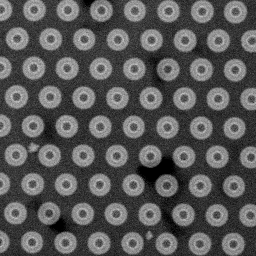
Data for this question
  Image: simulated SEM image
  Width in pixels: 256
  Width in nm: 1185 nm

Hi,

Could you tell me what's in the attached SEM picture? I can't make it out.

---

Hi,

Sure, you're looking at an array of small figures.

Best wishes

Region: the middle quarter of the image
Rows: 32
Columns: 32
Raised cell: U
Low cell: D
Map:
UUUUDDDUUUUUDDDUUUUUDDDUUUUUUDDD
UUUUDDDUUUUUDDDUUUUUDDDUUUUUUDDD
UUUDDDDUUUUUDDDUUUUUDDDDUUUUUDDD
UUDDDDDDUUUDDDDDUUUDDDDDUUUUDDDD
DDDDDDDDDDDDDDDDDDDDDDDDDDDDDDDD
DDDDDDDDDDDDDDDDDDDDDDDDDDDDDDDD
DDDUUUUDDDDDUUUDDDDDUUUUDDDDUUUU
DDUUUUUUDDDUUUUUDDDUUUUUDDDDUUUU
DDUUUUUUDDDUUUUUDDDUUUUUDDDUUUUU
DDUUUUUDDDDUUUUUDDDUUUUUDDDDUUUU
DDDUUUUDDDDUUUUDDDDDUUUUDDDDUUUU
DDDDDDDDDDDDDDDDDDDDDDDDDDDDDDDD
DDDDDDDDDDDDDDDDDDDDDDDDDDDDDDDD
UUUDDDDUUUUDDDDDUUUDDDDDUUUDDDDD
UUUDDDDUUUUUDDDUUUUUDDDUUUUUDDDD
UUUDDDUUUUUUDDDUUUUUDDDUUUUUDDDD
UUUDDDUUUUUUDDDUUUUUDDDUUUUUDDDD
UUUDDDDUUUUDDDDUUUUUDDDDUUUUDDDD
DDDDDDDDDDDDDDDDDDDDDDDDDUUDDDDD
DDDDDDDDDDDDDDDDDDDDDDDDDDDDDDDD
DDDUUUDDDDDDUUDDDDDDDUUDDDDDDDDD
DDDUUUUDDDDUUUUDDDDUUUUUDDDDUUUU
DDUUUUUDDDDUUUUUDDDUUUUUDDDUUUUU
DDUUUUUDDDDUUUUUDDDUUUUUDDDUUUUU
DDDUUUUDDDDUUUUDDDDUUUUUDDDDUUUU
DDDDUUDDDDDDUUDDDDDDUUUDDDDDDUUD
DDDDDDDDDDDDDDDDDDDDDDDDDDDDDDDD
UDDDDDDDDDDDDDDDDDDDDDDDDDDDDDDD
UUUDDDDUUUUDDDDUUUUDDDDDUUUUDDDD
UUUDDDUUUUUDDDDUUUUUDDDUUUUUDDDU
UUUDDDUUUUUUDDDUUUUUDDDUUUUUDDDU
UUUDDDDUUUUDDDDUUUUUDDDUUUUUDDDU